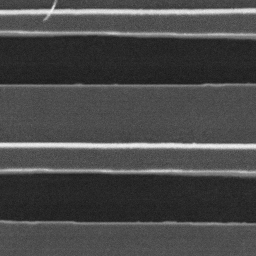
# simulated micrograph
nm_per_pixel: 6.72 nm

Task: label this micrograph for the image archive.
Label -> lines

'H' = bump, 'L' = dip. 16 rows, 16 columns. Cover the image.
HHHHHHHHHHHHHHHH
HHHHHHHHHHHHHHHH
LLLLLLLLLLLLLLLL
LLLLLLLLLLLLLLLL
LLLLLLLLLLLLLLLL
HHHHHHHHHHHHHHHH
HHHHHHHHHHHHHHHH
HHHHHHHHHHHHHHHH
HHHHHHHHHHHHHHHH
HHHHHHHHHHHHHHHH
HHHHHHHHHHHHHHHH
LLLLLLLLLLLLLLLL
LLLLLLLLLLLLLLLL
LLLLLLLLLLLLLLLL
HHHHHHHHHHHHHHHH
HHHHHHHHHHHHHHHH